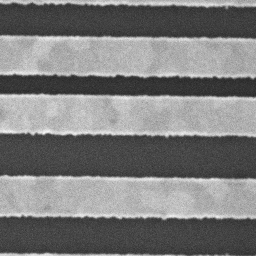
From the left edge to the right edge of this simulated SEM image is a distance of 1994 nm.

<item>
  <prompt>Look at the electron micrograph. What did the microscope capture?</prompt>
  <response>lines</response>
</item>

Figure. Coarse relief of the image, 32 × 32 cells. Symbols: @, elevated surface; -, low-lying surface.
-----@---@@@@@@@@@@@@@@@@@@@@@@@
--------------------------------
--------------------------------
--------------------------------
@@@-@---------------------------
@@@@@@@@@@@@@@@@@@@@@@@@@@@@@@@@
@@@@@@@@@@@@@@@@@@@@@@@@@@@@@@@@
@@@@@@@@@@@@@@@@@@@@@@@@@@@@@@@@
@@@@@@@@@@@@@@@@@@@@@@@@@@@@@@@@
-----------------@@@@--@@@@@@@@@
--------------------------------
--------------------------------
@@@@@@@@@@@@@@@@@@@@@@@@@@@@@@@@
@@@@@@@@@@@@@@@@@@@@@@@@@@@@@@@@
@@@@@@@@@@@@@@@@@@@@@@@@@@@@@@@@
@@@@@@@@@@@@@@@@@@@@@@@@@@@@@@@@
@@@@@@@@@@@@@@@@@@@@@@@@@@@@@@@@
--------------------------------
--------------------------------
--------------------------------
--------------------------------
--------------------------------
@@@@@@@@@@@@@@@@@@@@@@@@@@@@@@@@
@@@@@@@@@@@@@@@@@@@@@@@@@@@@@@@@
@@@@@@@@@@@@@@@@@@@@@@@@@@@@@@@@
@@@@@@@@@@@@@@@@@@@@@@@@@@@@@@@@
@@@@@@@@@@@@@@@@@@@@@@@@@@@@@@@@
--------------------------------
--------------------------------
--------------------------------
--------------------------------
--------------------------------